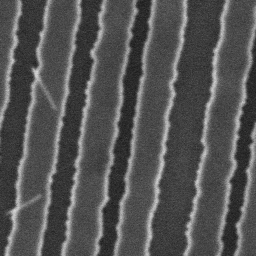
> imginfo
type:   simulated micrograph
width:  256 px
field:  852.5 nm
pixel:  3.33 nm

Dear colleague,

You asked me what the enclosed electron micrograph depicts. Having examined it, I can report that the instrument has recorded lines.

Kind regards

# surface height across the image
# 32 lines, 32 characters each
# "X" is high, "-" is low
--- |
XXX---XXXX---XXXX--XXXX-----XXXX
XXX---XXXX---XXXX--XXXX-----XXXX
XX----XXXX--XXXXX--XXXX-----XXXX
XX---XXXXX---XXX---XXXX-----XXXX
XX---XXXX---XXXX---XXXX-----XXXX
XX---XXXX---XXXX--XXXXX----XXXX-
XX---XXXX--XXXXX--XXXX-----XXXX-
XX---XXXX---XXXX--XXXX-----XXXX-
X----XXXX---XXXX--XXXX-----XXXX-
X---XXXXX--XXXX---XXXX-----XXXX-
X---XXXX---XXXX--XXXXX-----XXXX-
X---XXXX---XXXX--XXXXX----XXXXX-
X---XXXX---XXXX--XXXXX----XXXXX-
X---XXXX---XXXX--XXXX-----XXXX--
---XXXXX--XXXXX--XXXX-----XXXX--
---XXXXX--XXXXX--XXXX-----XXXX--
---XXXXX--XXXXX--XXXX----XXXXX--
---XXXX---XXXX---XXXX----XXXXX--
---XXXX---XXXX--XXXXX-----XXX--X
---XXXX---XXXX--XXXX-----XXXX--X
---XXXX--XXXXX--XXXX-----XXXX--X
--XXXXX---XXXX--XXXX-----XXXX--X
--XXXX---XXXX---XXXX-----XXXX--X
--XXXX---XXXX---XXXX-----XXXX--X
--XXXX---XXXX--XXXXX----XXXXX--X
--XXXX---XXXX--XXXXX----XXXXX--X
--XXXX--XXXXX--XXXX-----XXXX--XX
--XXXX--XXXXX--XXXX-----XXXX--XX
--XXXX--XXXXX--XXXX----XXXXX--XX
-XXXX---XXXXX--XXXX----XXXXX--XX
-XXXX---XXXX---XXXX-----XXXX--XX
-XXXX---XXXX--XXXX-----XXXXX-XXX